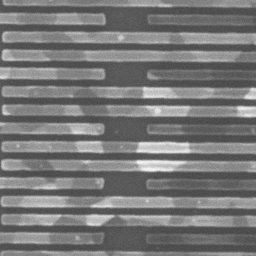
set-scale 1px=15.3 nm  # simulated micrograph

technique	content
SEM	wiring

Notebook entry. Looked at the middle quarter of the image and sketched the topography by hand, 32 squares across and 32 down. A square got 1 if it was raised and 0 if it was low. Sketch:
00000000000000000000000000000000
11111111110000000000000000000000
11111111110000000000011111111111
11111111110000000000011111111111
00000000000000000000000000000000
00000000000000000000000000000000
11111111111111111111111111111111
11111111111111111111111111111111
00000000000000000000000000000000
00000000000000000000000000000000
00000000000000000000000000000000
11111111111111111111111111111111
11111111111111111111111111111111
00000000000000000000000000000000
00000000000000000000000000000000
11111111110000000000011111111111
11111111110000000000011111111111
00000000000000000000000000000000
00000000000000000000000000000000
00000000000000000000000000000000
11111111111111111111111111111111
11111111111111111111111111111111
00000000000000000000000000000000
00000000000000000000000000000000
11111111111111111111111111111111
11111111111111111111111111111111
11111111111111111111111111111111
00000000000000000000000000000000
00000000000000000000000000000000
11111111110000000000011111111111
11111111110000000000011111111111
00000000000000000000000000000000